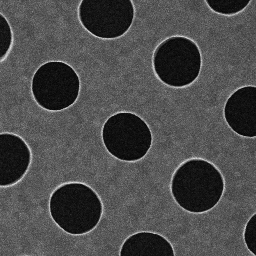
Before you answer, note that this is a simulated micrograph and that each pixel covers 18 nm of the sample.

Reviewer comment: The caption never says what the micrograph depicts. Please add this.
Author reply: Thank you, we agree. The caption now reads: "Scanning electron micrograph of holes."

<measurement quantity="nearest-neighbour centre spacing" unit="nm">1570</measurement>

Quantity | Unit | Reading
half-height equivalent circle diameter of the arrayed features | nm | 869